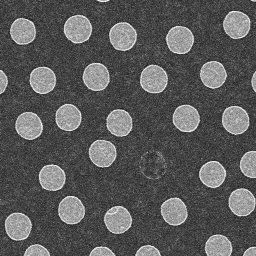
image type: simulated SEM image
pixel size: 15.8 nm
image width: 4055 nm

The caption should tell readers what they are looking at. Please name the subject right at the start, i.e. a regular array of raised bodies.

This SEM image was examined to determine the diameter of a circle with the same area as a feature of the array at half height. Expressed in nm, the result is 420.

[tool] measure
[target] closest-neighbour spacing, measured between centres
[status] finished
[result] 735 nm